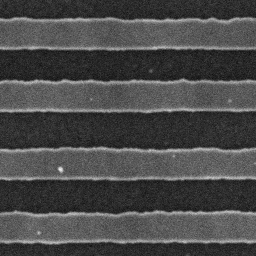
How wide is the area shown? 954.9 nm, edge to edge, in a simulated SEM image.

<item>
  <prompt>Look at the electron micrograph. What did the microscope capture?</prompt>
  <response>lines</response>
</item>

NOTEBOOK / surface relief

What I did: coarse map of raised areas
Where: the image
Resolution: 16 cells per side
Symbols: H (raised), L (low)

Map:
LLLLLLLLLLLLLLLL
HHHHHHHHHHHHHHHH
HHHHHHHHHHHHHHHH
LLLLLLLLLLLLLLLL
LLLLLLLLLLLLLLLL
HHHHHHHHHHHHHHHH
HHHHHHHHHHHHHHHH
LLLLLLLLLLLLLLLL
LLLLLLLLLLLLLLLL
HHHHHHHHHHHHHHHH
HHHHHHHHHHHHHHHH
LLLLLLLLLLLLLLLL
LLLLLLLLLLLLLLLL
HHHHHHHHHHHHHHHH
HHHHHHHHHHHHHHHH
LLLLLLLLLLLLLLLL